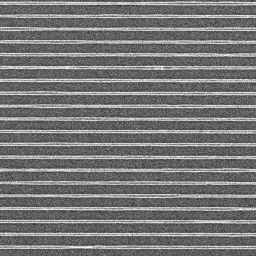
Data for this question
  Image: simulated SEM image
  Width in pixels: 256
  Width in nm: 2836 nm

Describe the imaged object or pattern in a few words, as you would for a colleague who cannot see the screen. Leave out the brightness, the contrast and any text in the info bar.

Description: parallel lines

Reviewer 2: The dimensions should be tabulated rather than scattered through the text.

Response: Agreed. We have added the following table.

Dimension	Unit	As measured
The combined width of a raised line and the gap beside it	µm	0.142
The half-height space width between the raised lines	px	10.6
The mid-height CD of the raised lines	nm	24.9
